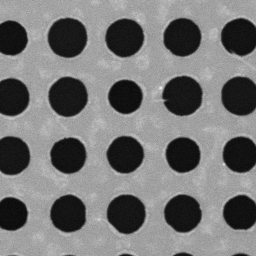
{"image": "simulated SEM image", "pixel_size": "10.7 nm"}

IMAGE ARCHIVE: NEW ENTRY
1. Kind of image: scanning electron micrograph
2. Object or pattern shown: a regular array of holes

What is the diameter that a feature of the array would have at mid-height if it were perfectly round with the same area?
0.404 µm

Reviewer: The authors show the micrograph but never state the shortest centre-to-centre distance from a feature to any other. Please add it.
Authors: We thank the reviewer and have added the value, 0.61 micrometres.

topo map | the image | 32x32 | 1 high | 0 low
11111111111111111111111111111111
11111111111111111111111111111111
11111110001111100111110011111001
00011100000111000011100001110000
00011100000110000011000001110000
00011100000110000011000001110000
00011110001111000111100011111001
11111111111111111111111111111111
11111111111111111111111111111111
11111111111111111111110111111111
00011110001111000111100001110000
00001100000111000011000001110000
00001100000111000011100001110000
00011110001111000111100001110000
10111111011111111111111111111111
11111111111111111111111111111111
11111111111111111111111111111111
00011110001111000111110011111001
00001110000111000011100001110000
00001100000110000011100001110000
00001110001111000011100001110000
00011111001111100111111111111101
11111111111111111111111111111111
11111111111111111111111111111111
11111111011111100111110011111101
00011110000111000011100001110000
00011100000110000011100001110000
00011100000111000011100001110000
00011110001111000111110011111001
11111111111111111111111111111111
11111111111111111111111111111111
11111111111111111111111111111111